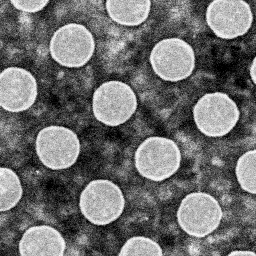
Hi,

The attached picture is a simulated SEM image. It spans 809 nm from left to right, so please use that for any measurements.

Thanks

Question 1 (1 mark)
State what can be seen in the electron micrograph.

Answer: a regular array of raised bodies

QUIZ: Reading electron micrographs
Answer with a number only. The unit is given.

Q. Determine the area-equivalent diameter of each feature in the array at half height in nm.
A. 135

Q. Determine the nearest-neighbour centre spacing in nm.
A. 221